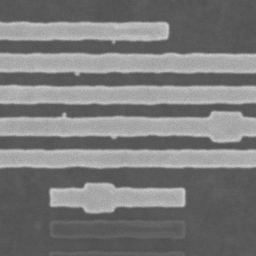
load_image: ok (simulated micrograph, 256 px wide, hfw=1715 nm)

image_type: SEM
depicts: wiring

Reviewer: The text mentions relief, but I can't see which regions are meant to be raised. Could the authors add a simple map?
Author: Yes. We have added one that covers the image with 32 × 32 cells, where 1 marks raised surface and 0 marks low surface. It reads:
00000000000000000000000000000000
00000000000000000000000000000000
00000000000000000000000000000000
11111111111111111111100000000000
11111111111111111111100000000000
00000000000000000000000000000000
00000000000000000000000000000000
11111111111111111111111111111111
11111111111111111111111111111111
00000000000000000000000000000000
00000000000000000000000000000000
11111111111111111111111111111111
11111111111111111111111111111111
00000000000000000000000000000000
00000000000000000000000000111100
11111111111111111111111111111111
11111111111111111111111111111111
00000000000000000000000000011100
00000000000000000000000000000000
11111111111111111111111111111111
11111111111111111111111111111111
00000000000000000000000000000000
00000000000000000000000000000000
00000000001111100000000000000000
00000011111111111111111000000000
00000011111111111111111000000000
00000000000111000000000000000000
00000000000000000000000000000000
00000011111111111111111000000000
00000001111111111111111000000000
00000000000000000000000000000000
00000000000110000000011000000000